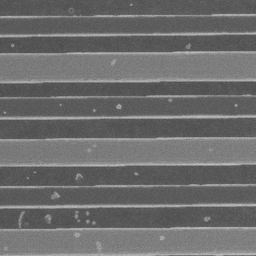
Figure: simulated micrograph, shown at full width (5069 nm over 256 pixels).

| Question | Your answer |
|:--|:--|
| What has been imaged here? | lines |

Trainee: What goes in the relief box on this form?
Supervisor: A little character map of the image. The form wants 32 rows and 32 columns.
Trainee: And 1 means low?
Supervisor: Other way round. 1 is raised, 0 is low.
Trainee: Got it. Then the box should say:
00000000000000000000000000000000
00000000000000000000000000000000
11111111111111111111111111111111
11111111111111111111111111111111
00000000000000000000000000000000
00000000000000000000000000000000
00000000000000000000000000000000
11111111111111111111111111111111
11111111111111111111111111111111
11111111111111111111111111111111
00000000000000000000000000000000
00000000000000000000000000000000
11111111111111111111111111111111
11111111111111111111111111111111
11111111111111111111111111111111
00000000000000000000000000000000
00000000000000000000000000000000
11111111111111111111111111111111
11111111111111111111111111111111
11111111111111111111111111111111
11111111111111111111111110000000
00000000000000000000000000000000
00000000000000000000000000000000
11111111111111111111111111111111
11111111111111111111111111111111
11111111111111111111111111111111
00000000000000000000000000000000
00000000000000000000000000000000
00000000000000000000000111111111
11111111111111111111111111111111
11111111111111111111111111111111
11111111111111111111111111111111